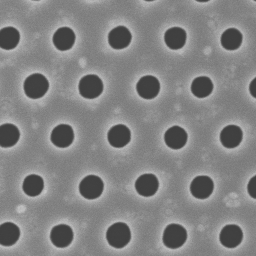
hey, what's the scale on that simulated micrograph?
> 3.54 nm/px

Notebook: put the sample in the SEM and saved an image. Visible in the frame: a regular array of holes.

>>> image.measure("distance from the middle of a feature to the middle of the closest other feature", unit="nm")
196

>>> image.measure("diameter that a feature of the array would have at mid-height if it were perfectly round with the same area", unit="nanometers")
80.4